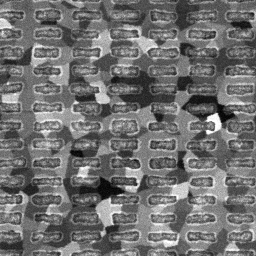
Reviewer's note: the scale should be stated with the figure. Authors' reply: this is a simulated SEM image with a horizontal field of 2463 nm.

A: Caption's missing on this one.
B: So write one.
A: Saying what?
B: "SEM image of a regular array of holes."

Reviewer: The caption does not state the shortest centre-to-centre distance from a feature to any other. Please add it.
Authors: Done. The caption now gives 18.1 px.